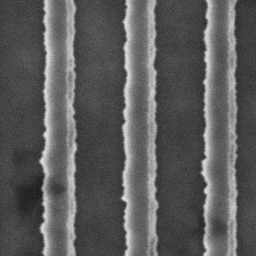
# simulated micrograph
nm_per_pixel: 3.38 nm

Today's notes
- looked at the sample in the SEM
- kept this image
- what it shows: lines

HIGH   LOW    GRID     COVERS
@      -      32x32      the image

------@@@-------@@@-------@@@---
------@@@-------@@@-------@@@---
------@@@-------@@@-------@@@---
------@@@-------@@@-------@@@---
------@@@-------@@@-------@@@---
------@@@-------@@@-------@@@---
------@@@-------@@@-------@@@---
------@@@-------@@@-------@@@---
------@@@-------@@@-------@@@---
------@@@-------@@@-------@@@---
------@@@-------@@@-------@@@---
------@@@-------@@@-------@@@---
------@@@-------@@@-------@@@---
------@@@-------@@@-------@@@---
------@@@-------@@@-------@@@---
------@@@-------@@@-------@@@---
------@@@------@@@@-------@@@---
------@@@-------@@@-------@@@---
------@@@-------@@@-------@@@---
-----@@@@-------@@@-------@@@---
-----@@@@-------@@@------@@@@---
------@@@-------@@@------@@@@---
------@@@------@@@@-------@@@---
-----@@@@-------@@@-------@@@---
-----@@@@------@@@@-------@@@@--
-----@@@@-------@@@@------@@@---
------@@@-------@@@-------@@@---
------@@@-------@@@@------@@@---
-----@@@@-------@@@-------@@@---
-----@@@@-------@@@@------@@@---
------@@@-------@@@@------@@@---
-----@@@@-------@@@@------@@@---